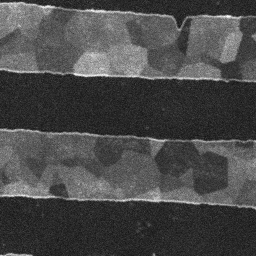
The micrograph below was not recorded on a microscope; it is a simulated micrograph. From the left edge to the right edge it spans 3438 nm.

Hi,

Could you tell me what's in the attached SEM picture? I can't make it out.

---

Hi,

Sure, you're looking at one or a few lines or trenches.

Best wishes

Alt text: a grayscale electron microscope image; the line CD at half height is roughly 865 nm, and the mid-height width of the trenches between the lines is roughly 60.1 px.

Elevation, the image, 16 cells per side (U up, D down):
UUUUDDDDDDDDDDDD
UUUUUUUUUUUUUUUU
UUUUUUUUUUUUUUUU
UUUUUUUUUUUUUUUU
DDDUUUUUUUUUUUUU
DDDDDDDDDDDDDDDD
DDDDDDDDDDDDDDDD
DDDDDDDDDDDDDDDD
UUUUUUDDDDDDDDDD
UUUUUUUUUUUUUUUU
UUUUUUUUUUUUUUUU
UUUUUUUUUUUUUUUU
DDDDDDDUDUUUUUUU
DDDDDDDDDDDDDDDD
DDDDDDDDDDDDDDDD
DDDDDDDDDDDDDDDD